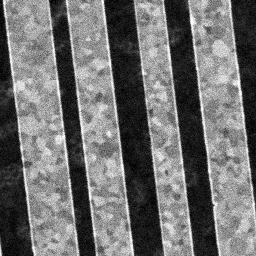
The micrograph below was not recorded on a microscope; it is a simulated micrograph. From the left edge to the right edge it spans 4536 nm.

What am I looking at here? one or a few lines or trenches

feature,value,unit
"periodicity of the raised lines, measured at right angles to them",1080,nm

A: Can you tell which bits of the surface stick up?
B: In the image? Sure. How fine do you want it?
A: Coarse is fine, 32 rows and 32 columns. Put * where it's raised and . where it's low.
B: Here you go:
.*****..*****....***...******...
.*****...****....****...*****...
.*****...****....****...*****...
.*****...****....****...*****...
.******..****....****...*****...
.******..****....****...*****...
.******..*****....***...*****...
.******..*****....***....*****..
.******..*****....***....*****..
..*****..*****....***....*****..
..*****...****....****...*****..
..*****...****....****...*****..
..*****...****....****...*****..
..******..****....****...*****..
..******..*****....***...*****..
..******..*****....***...******.
..******..*****....***....*****.
...*****..*****....***....*****.
...*****...****....****...*****.
...*****...****....****...*****.
...*****...****....****...*****.
...******..****....****...*****.
...******..*****....***...*****.
...******..*****....***...*****.
...******..*****....***....*****
....*****..*****....***....*****
....*****...****....****...*****
....*****...****....****...*****
....*****...****....****...*****
....******..****....****...*****
....******..****....****...*****
....******..*****...****...*****